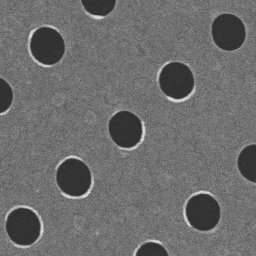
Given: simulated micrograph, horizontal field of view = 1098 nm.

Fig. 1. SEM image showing holes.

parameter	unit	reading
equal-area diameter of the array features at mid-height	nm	153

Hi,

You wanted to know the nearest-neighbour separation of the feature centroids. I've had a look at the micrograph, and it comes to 303 nm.